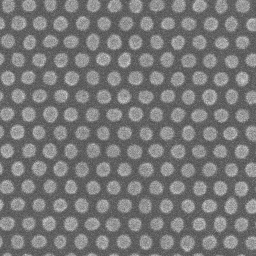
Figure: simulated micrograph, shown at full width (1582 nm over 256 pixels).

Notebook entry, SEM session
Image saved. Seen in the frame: a regular array of raised bodies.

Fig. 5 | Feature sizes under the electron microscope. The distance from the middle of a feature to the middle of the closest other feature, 127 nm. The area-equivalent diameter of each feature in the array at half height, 12.9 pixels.